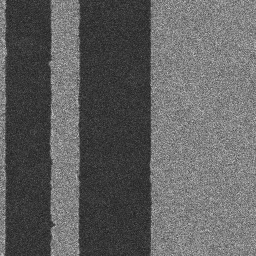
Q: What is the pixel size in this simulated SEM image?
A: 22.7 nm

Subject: one or a few lines or trenches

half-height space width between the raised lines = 596 nm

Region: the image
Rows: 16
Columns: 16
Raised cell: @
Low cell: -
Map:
@@@--@@@@-------
@@@--@@@@-------
@@@--@@@@-------
@@@--@@@@-------
@@@--@@@@-------
@@@--@@@@-------
@@@--@@@@-------
@@@--@@@@@------
@@@--@@@@-------
@@@--@@@@-------
@@@--@@@@-------
@@@--@@@@-------
@@@--@@@@@------
@@@--@@@@@------
@@@--@@@@-------
@@@--@@@@-------